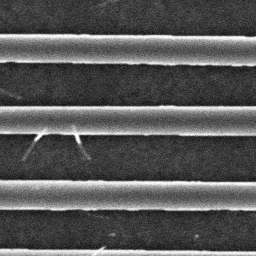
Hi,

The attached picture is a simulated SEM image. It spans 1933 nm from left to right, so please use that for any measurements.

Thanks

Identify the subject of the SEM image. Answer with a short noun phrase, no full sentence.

lines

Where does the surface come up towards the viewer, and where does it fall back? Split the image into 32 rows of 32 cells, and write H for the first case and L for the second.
LLLLLLLLLLLLLLLLLLLLLLLLLLLLLLLL
LLLLLLLLLLLLLLLLLLLLLLLLLLLLLLLL
LLLLLLLLLLLLLLLLLLLLLLLLLLLLLLLL
LLLLLLLLLLLLLLLLLLLLLLLLLLLLLLLL
HHHHHHHHHHHHHHHHHLHHHLLLLLLLLLLL
HHHHHHHHHHHHHHHHHHHHHHHHHHHHHHHH
HHHHHHHHHHHHHHHHHHHHHHHHHHHHHHHH
HHHHHHHHHHHHHHHHHHHHHHHHHHHHHHHH
LLLLLLLLLLLLLLLLLLLLLLLLLLLLLLLL
LLLLLLLLLLLLLLLLLLLLLLLLLLLLLLLL
LLLLLLLLLLLLLLLLLLLLLLLLLLLLLLLL
LLLLLLLLLLLLLLLLLLLLLLLLLLLLLLLL
LLLLLLLLLLLLLLLLLLLLLLLLLLLLLLLL
HHHHHHHHHHHHHHHHHHHHHHHHHHHHHHHH
HHHHHHHHHHHHHHHHHHHHHHHHHHHHHHHH
HHHHHHHHHHHHHHHHHHHHHHHHHHHHHHHH
HHHHHHHHHHHHHHHHHHHHHHHHHHHHHHHH
LLLLLLLLLLLLLLLLLLLLLLLLLLLLLLLL
LLLLLLLLLLLLLLLLLLLLLLLLLLLLLLLL
LLLLLLLLLLLLLLLLLLLLLLLLLLLLLLLL
LLLLLLLLLLLLLLLLLLLLLLLLLLLLLLLL
LLLLLLLLLLLLLLLLLLLLLLLLLLLLLLLL
LLLLLLLLLLLLLLLLLLLLLLLLLLLLLLLL
HHHHHHHHHHHHHHHHHHHHHHHHHHHHHHHH
HHHHHHHHHHHHHHHHHHHHHHHHHHHHHHHH
HHHHHHHHHHHHHHHHHHHHHHHHHHHHHHHH
LLLLLLLLLLLLLLLLLLLLLLLLLLLLLLLL
LLLLLLLLLLLLLLLLLLLLLLLLLLLLLLLL
LLLLLLLLLLLLLLLLLLLLLLLLLLLLLLLL
LLLLLLLLLLLLLLLLLLLLLLLLLLLLLLLL
LLLLLLLLLLLLLLLLLLLLLLLLLLLLLLLL
HHHHHHHHHHHHHHHHHHHHHHHHLLLLLLLL